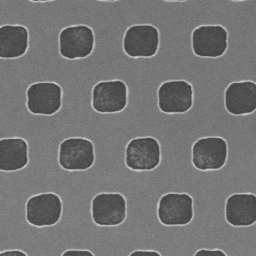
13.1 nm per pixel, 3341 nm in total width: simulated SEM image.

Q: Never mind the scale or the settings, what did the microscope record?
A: a regular array of holes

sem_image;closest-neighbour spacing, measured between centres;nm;838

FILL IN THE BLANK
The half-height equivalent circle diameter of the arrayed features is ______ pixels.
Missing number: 34.6